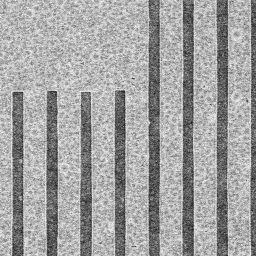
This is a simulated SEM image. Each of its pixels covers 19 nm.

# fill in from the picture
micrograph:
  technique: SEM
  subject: parallel lines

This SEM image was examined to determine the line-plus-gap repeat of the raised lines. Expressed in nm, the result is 645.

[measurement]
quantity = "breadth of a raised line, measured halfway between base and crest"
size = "412 nanometers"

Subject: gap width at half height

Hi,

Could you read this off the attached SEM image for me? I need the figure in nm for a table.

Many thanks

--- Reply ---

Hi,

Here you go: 231